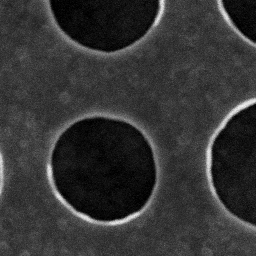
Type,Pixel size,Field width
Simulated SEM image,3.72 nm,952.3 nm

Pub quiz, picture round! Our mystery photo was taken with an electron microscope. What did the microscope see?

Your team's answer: holes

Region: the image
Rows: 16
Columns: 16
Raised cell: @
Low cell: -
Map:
@@@-------@@@@--
@@@@------@@@@@-
@@@@@----@@@@@@@
@@@@@@@@@@@@@@@@
@@@@@@@@@@@@@@@@
@@@@@@@@@@@@@@@@
@@@@@@@@@@@@@@@@
@@@@@--@@@@@@@--
@@@@-----@@@@@--
@@@-------@@@---
@@@-------@@@---
@@@-------@@@---
@@@@-----@@@@@--
@@@@@---@@@@@@@-
@@@@@@@@@@@@@@@@
@@@@@@@@@@@@@@@@